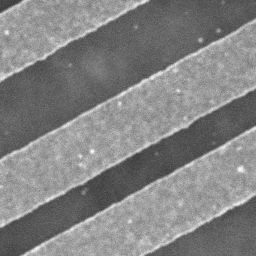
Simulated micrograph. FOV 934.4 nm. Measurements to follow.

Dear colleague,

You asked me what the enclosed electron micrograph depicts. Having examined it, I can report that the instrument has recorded lines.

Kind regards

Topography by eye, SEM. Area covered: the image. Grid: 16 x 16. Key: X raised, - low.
-XXXXXXX--------
XXXXXXX--------X
XXXXX---------XX
XXX---------XXXX
X---------XXXXXX
--------XXXXXXXX
------XXXXXXXX--
-----XXXXXXX----
---XXXXXXX-----X
-XXXXXXXX----XXX
XXXXXXX----XXXXX
XXXXX----XXXXXXX
XXX-----XXXXXXX-
X-----XXXXXXXX--
----XXXXXXXX----
--XXXXXXXX------